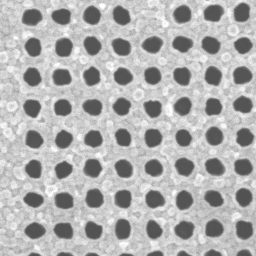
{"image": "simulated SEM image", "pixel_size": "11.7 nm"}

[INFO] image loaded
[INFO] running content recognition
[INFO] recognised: a regular array of holes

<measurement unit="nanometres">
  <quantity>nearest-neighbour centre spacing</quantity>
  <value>345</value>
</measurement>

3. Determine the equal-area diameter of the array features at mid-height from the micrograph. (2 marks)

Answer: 209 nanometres